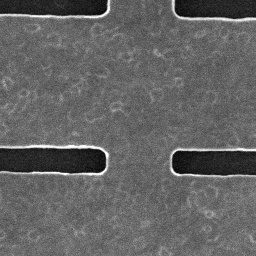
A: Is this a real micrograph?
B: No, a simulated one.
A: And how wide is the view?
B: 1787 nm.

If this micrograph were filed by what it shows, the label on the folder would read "holes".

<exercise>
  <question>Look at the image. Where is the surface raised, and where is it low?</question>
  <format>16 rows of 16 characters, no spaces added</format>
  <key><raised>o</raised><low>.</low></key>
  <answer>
.......oooo.....
oooooooooooooooo
oooooooooooooooo
oooooooooooooooo
oooooooooooooooo
oooooooooooooooo
oooooooooooooooo
oooooooooooooooo
oooooooooooooooo
......ooooo.....
......ooooo.....
oooooooooooooooo
oooooooooooooooo
oooooooooooooooo
oooooooooooooooo
oooooooooooooooo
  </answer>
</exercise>